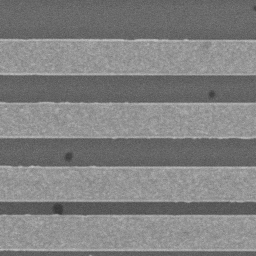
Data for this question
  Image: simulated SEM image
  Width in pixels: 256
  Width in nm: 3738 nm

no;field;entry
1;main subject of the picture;lines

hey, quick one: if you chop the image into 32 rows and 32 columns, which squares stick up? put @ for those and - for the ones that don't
--------------------------------
--------------------------------
--------------------------------
--------------------------------
--------------------------------
@@@@@@@@@@@@@@@@@@@@@@@@@@@@@@@@
@@@@@@@@@@@@@@@@@@@@@@@@@@@@@@@@
@@@@@@@@@@@@@@@@@@@@@@@@@@@@@@@@
@@@@@@@@@@@@@@@@@@@@@@@@@@@@@@@@
--------------------------------
--------------------------------
--------------------------------
--------------------------------
@@@@@@@@@@@@@@@@@@@@@@@@@@@@@@@@
@@@@@@@@@@@@@@@@@@@@@@@@@@@@@@@@
@@@@@@@@@@@@@@@@@@@@@@@@@@@@@@@@
@@@@@@@@@@@@@@@@@@@@@@@@@@@@@@@@
--------------------------------
--------------------------------
--------------------------------
--------------------------------
@@@@@@@@@@@@@@@@@@@@@@@@@@@@@@@@
@@@@@@@@@@@@@@@@@@@@@@@@@@@@@@@@
@@@@@@@@@@@@@@@@@@@@@@@@@@@@@@@@
@@@@@@@@@@@@@@@@@@@@@@@@@@@@@@@@
--------------------------------
--------------------------------
@@@@@@@@@@@@@@@@@@@@@@@@@@@@@@@@
@@@@@@@@@@@@@@@@@@@@@@@@@@@@@@@@
@@@@@@@@@@@@@@@@@@@@@@@@@@@@@@@@
@@@@@@@@@@@@@@@@@@@@@@@@@@@@@@@@
--------------------------------